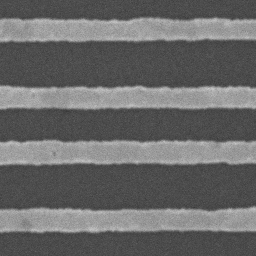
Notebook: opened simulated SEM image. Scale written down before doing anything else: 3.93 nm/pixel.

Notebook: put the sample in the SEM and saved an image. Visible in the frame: lines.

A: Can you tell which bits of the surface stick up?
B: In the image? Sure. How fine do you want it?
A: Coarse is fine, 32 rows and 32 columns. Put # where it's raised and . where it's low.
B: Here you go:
................................
................................
.................##.............
#####.##########################
################################
................................
................................
................................
................................
................................
................................
################################
################################
................................
................................
................................
................................
................................
######.#########################
######.#########################
................................
................................
................................
................................
................................
................................
...#######...########.###..##.##
################################
###########.########..##########
................................
................................
................................